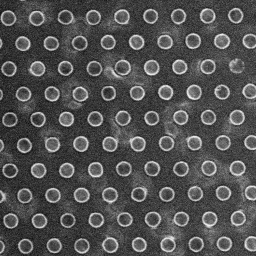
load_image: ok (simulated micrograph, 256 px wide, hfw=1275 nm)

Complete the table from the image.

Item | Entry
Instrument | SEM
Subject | a regular array of raised bodies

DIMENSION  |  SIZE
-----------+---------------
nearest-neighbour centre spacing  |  140 nanometers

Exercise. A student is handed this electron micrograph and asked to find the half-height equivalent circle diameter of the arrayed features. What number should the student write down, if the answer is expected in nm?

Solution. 69.3